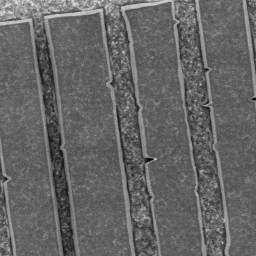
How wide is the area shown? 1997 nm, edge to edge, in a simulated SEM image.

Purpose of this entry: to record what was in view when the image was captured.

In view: one or a few lines or trenches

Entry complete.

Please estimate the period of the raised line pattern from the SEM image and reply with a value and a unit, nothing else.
0.564 µm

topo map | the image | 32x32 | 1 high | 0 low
00000000000000000001110001111110
00000000000110011111110001111110
00000011111110001111110001111110
11110011111110001111110001111110
11110011111110001111110001111110
11110011111110001111110001111110
11110011111110001111110001111110
11111001111111000111110000111111
11111001111111000111111000111111
11111001111111000111111000111111
11111001111111000111111000111111
11111001111111000111111000111111
11111001111111000111111000111111
11111001111111000111111000111111
11111101111111100111111000111111
11111100111111100011111000011111
11111100111111100011111100011111
11111100111111100011111100011111
11111100111111100011111100011111
11111100111111100011111100011111
11111100111111100011111100011111
11111100111111100011111100011111
01111100111111110011111110001111
01111110011111110001111110001111
01111110011111110001111110001111
01111110011111110001111110001111
01111110011111110001111110001111
01111110011111110001111110001111
01111110011111110001111110001111
01111110011111110000111110001111
00111111011111110000111110001111
00111111001111111000111111001111